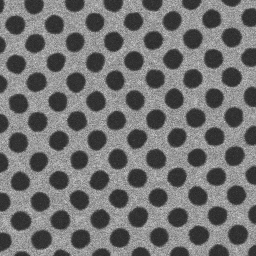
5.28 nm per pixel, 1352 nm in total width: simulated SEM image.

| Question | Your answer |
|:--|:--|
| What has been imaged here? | a regular array of holes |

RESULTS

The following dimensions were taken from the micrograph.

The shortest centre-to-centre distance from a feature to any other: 0.142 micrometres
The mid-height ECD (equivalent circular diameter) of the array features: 104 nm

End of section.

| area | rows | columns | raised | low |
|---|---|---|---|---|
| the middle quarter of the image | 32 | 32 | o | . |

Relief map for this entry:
oooooo....ooooo.....ooooo....ooo
oooooo...ooooooo...oo...oooooooo
oo..ooooooo....oooooo....ooooo..
o....ooooo.....ooooo.....ooooo..
o....oooooo....ooooo.....ooooo..
o....oooooo....oooooo...oooooo..
oo..oooooooo..oooooooooooo...ooo
oooooo....oooooo....oooooo....oo
.ooooo....ooooo.....ooooo.....oo
.oooo......oooo.....ooooo.....oo
.ooooo....oooooo....oooooo...ooo
ooooooo...ooooooo..ooo..ooooooo.
o....ooooooo...oooooo....ooooo..
o.....ooooo....oooooo....ooooo..
o.....ooooo....oooooo....ooooo..
o....oooooo....oooooo....oooooo.
oo..oooooooo.oooo...ooooooo...oo
.ooooo....oooooo.....ooooo.....o
.ooooo.....ooooo.....ooooo.....o
.ooooo.....ooooo.....ooooo....oo
oooooo....oooooo....ooooooo..ooo
ooooooo..ooo..oooooooo..oooooooo
oo....ooooo....oooooo....oooooo.
oo....ooooo.....oooo......ooooo.
oo....ooooo.....ooooo....oooooo.
oo....oooooo...oooooo....ooooooo
ooooooooooooooooo...ooooooo...oo
.oooooo....ooooo.....ooooo.....o
.oooooo....ooooo.....ooooo.....o
.ooooo.....ooooo.....ooooo....oo
.ooooo.....oooooo...ooooooo..ooo
oooooooo.oooo..ooooooo...oooooo.